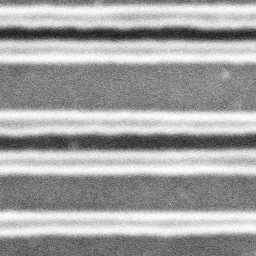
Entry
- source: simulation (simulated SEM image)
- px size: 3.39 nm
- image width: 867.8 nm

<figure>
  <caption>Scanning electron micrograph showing lines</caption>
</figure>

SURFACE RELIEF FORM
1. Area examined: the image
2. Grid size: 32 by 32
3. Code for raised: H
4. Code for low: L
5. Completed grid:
LLLLLLLLLLLLLLLLLLLLLLLLLLLLLLLL
HHHHHHHHHHHHHHHHHHHHHHHHHHHHHHHH
HHHHHHHHHHHHHHHHHHHHHHHHHHHHHHHH
LLLLLLLLLLLLLLLLLLLLLLLLLLLLLLLL
LLLLLLLLLLLLLLLLLLLLLLLLLLLLLLLL
HHHHHHHHHHHHHHHHHHHHHHHHHHHHHHHH
HHHHHHHHHHHHHHHHHHHHHHHHHHHHHHHH
HHHHHHLHHHLLLLHHHHHHLLLLLHLLLHHL
LLLLLLLLLLLLLLLLLLLLLLLLLLLLLLLL
LLLLLLLLLLLLLLLLLLLLLLLLLLLLLLLL
LLLLLLLLLLLLLLLLLLLLLLLLLLLLLLLL
LLLLLLLLLLLLLLLLLLLLLLLLLLLLLLLL
LLLLLLLLLLLLLLLLLLLLLLLLLLLLLLLL
LLLLLLLLLLLLLLLLLLLLLLLLLLLLLLLL
HHHHHHHHHHHHHHHHHHHHHHHHHHHHHHHH
HHHHHHHHHHHHHHHHHHHHHHHHHHHHHHHH
HHHHHHHHHHHLHHHLLHHHLHHHHHHHHHHL
LLLLLLLLLLLLLLLLLLLLLLLLLLLLLLLL
LLLLLLLLLLLLLLLLLLLLLLLLLLLLLLLL
HHHHHHHHHHHHHHHHHHHHHHHHHHHHHHHH
HHHHHHHHHHHHHHHHHHHHHHHHHHHHHHHH
LLLLHHLHHHHHHHHHLLLLHLLLLLLLHHHH
LLLLLLLLLLLLLLLLLLLLLLLLLLLLLLLL
LLLLLLLLLLLLLLLLLLLLLLLLLLLLLLLL
LLLLLLLLLLLLLLLLLLLLLLLLLLLLLLLL
LLLLLLLLLLLLLLLLLLLLLLLLLLLLLLLL
LLLLLLLLLLLLLLLLLLLLLLLLLLLLLLLL
HHHHHHHHHHHHHHHHHHHHHHHHHHHHHHHH
HHHHHHHHHHHHHHHHHHHHHHHHHHHHHHHH
LLLLLLLLLLLLLLLLLLLLLLLLLLLLLLLL
LLLLLLLLLLLLLLLLLLLLLLLLLLLLLLLL
LLLLLLLLLLLLLLLLLLLLLLLLLLLLLLLL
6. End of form